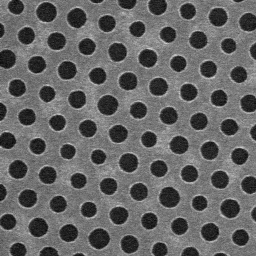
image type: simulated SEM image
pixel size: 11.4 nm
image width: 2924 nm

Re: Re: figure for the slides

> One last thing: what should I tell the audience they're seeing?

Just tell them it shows a regular array of holes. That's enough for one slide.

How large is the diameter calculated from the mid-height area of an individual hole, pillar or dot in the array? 211 nanometers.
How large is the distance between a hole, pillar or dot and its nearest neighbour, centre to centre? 349 nanometres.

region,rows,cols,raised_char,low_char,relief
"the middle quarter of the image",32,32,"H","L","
LLLHHHHHHHHHHHHHHHHLLLHHHHLLLLLH
LLLHHHHLLLHHHHHHHHHHHHHHHHHLLLHH
LLLHHHLLLLLHHHLLLLHHHHHHHHHHHHHH
LLHHHHLLLLLHHHLLLLHHHHHLLHHHHHHH
HHHHHHHLLLHHHLLLLLHHHLLLLLHHHHHH
HHHHHHHHHHHHHHLLLLHHHLLLLLHHHLLL
HHHLHHHHHHHHHHHLLHHHHLLLLLHHHLLL
HLLLLHHHHHHHHHHHHHHHHHLLLHHHHLLL
HLLLLLHHHLLLLHHHHHHHHHHHHHHHHLLL
HLLLLLHHLLLLLLHHHHLHHHHHHHHHHHHH
HHLLLHHHLLLLLLHHHLLLLHHHHHHHHHHH
HHHHHHHHHLLLLHHHLLLLLHHHLLLLHHHH
HHHHHHHHHLLLHHHHLLLLLHHHLLLLHHHH
HHHHHHHHHHHHHHHHHLLLHHHHLLLLLHHH
LHHHLLLLHHHHHHHHHHHHHHHHLLLLHHHL
HHHHLLLLHHHHLLLHHHHHHHHHHHHHHHHH
HHHHLLLLHHHLLLLLHHHHHHHHHHHHHHHH
HHHHLLLLHHHLLLLLHHHHLLLHHHHHHHHH
HHHHHHHHHHHLLLLLHHHLLLLHHHHLLLHH
HHHHHHHHHHHHLLLHHHHLLLLHHHLLLLLH
LLHHHHHHHHHHHHHHHHHHLLLHHHLLLLLH
LLLHHHHHLLHHHHHHHHHHHHHHHHHLLLLH
LLLHHHHLLLHHHHHLLHHHHHHHHHHHLLHH
LLHHHHHLLLLHHHLLLLHHHHHHHHHHHHHH
HHHHHHHLLLHHHHLLLLLHHHLLLHHHHHHH
HHHHHHHHHHHHHHLLLLLHHLLLLLHHHHLL
HHHHHHHHHHHHHHLLLLHHHLLLLLHHHLLL
HHLLLHHHHHHHHHHHHHHHHHLLLLHHHLLL
HHLLLLHHHHLLHHHHHHHHHHHHHHHHHLLL
HLLLLLHHHLLLLHHHHHHHHHHHHHHHHHLL
HHLLLHHHHLLLLHHHHLLLLHHHHHHHHHHH
HHHHHHHHHLLLLHHHLLLLLHHHLLLLHHHH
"